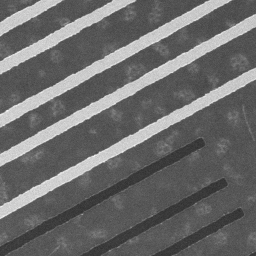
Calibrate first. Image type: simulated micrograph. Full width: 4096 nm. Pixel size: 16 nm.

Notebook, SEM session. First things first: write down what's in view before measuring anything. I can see parallel lines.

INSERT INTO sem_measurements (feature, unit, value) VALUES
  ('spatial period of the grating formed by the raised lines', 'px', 40.5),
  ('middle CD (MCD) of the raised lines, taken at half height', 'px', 10.7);